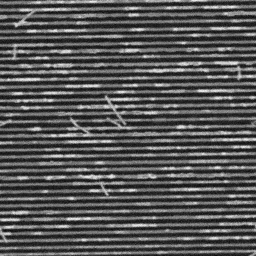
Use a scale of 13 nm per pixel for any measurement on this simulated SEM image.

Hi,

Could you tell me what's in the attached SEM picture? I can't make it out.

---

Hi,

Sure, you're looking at parallel lines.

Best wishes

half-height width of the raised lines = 35.7 nanometers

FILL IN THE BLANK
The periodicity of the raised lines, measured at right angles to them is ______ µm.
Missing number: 0.0906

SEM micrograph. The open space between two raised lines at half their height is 60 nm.